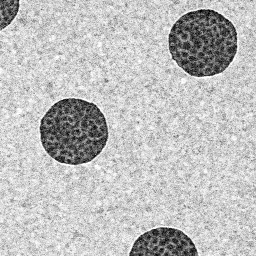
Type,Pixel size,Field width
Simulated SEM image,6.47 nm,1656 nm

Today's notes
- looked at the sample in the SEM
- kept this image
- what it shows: holes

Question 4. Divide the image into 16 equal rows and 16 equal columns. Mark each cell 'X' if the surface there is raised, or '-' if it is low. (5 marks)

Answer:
-XXXXXXXXXXXXXXX
-XXXXXXXXXX----X
XXXXXXXXXXX----X
XXXXXXXXXXX----X
XXXXXXXXXXXX--XX
XXXXXXXXXXXXXXXX
XXX---XXXXXXXXXX
XXX----XXXXXXXXX
XX-----XXXXXXXXX
XXX---XXXXXXXXXX
XXXXXXXXXXXXXXXX
XXXXXXXXXXXXXXXX
XXXXXXXXXXXXXXXX
XXXXXXXXXXXXXXXX
XXXXXXXXX--XXXXX
XXXXXXXX----XXXX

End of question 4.